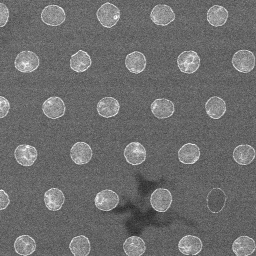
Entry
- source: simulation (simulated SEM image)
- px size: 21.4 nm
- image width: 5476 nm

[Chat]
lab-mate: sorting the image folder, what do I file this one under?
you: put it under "a regular array of holes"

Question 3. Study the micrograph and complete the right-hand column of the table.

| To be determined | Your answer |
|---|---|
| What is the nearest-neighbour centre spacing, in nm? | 1130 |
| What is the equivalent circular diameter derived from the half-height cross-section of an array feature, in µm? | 0.457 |